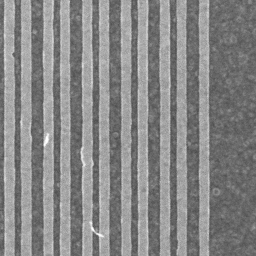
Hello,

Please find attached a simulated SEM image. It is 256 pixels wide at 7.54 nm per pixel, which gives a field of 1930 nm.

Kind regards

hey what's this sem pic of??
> parallel lines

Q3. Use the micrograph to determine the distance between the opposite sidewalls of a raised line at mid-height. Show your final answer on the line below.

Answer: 68.8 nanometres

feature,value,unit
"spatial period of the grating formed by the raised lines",147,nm